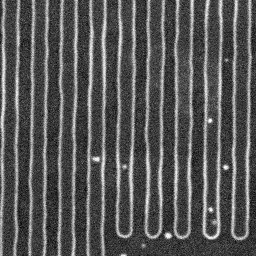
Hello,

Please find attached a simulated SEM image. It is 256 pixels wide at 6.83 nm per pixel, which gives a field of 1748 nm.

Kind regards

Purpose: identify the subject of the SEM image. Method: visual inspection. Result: groups of lines, slits or small figures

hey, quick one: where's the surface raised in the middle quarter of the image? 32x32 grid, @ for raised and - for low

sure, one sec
@@@----@@@----@@@@---@@@@---@@@@
@@@----@@@----@@@@---@@@@---@@@@
@@@----@@@----@@@@---@@@@---@@@@
@@@----@@@----@@@@---@@@@---@@@@
@@@----@@@----@@@@---@@@@---@@@@
@@@----@@@----@@@@---@@@@---@@@@
@@@---@@@@----@@@@---@@@@---@@@@
@@@---@@@@----@@@@---@@@@---@@@@
@@@---@@@@----@@@@---@@@@---@@@@
@@@---@@@@----@@@@---@@@@---@@@@
@@@---@@@@----@@@----@@@----@@@@
@@@---@@@@----@@@----@@@----@@@@
@@@---@@@@----@@@----@@@----@@@@
@@@---@@@@----@@@----@@@----@@@@
@@@---@@@@----@@@----@@@----@@@@
@@@---@@@@----@@@----@@@----@@@@
@@@---@@@@----@@@----@@@----@@@@
@@@---@@@@----@@@----@@@----@@@@
@@@---@@@@---@@@@----@@@----@@@@
@@@---@@@@---@@@@----@@@----@@@@
@@@---@@@@---@@@@----@@@----@@@@
@@@---@@@@---@@@@----@@@----@@@@
@@@---@@@@----@@@----@@@----@@@@
@@@---@@@@----@@@----@@@----@@@@
@@@---@@@@----@@@----@@@----@@@-
@@@---@@@@----@@@----@@@----@@@-
@@@---@@@@----@@@----@@@----@@@-
@@@---@@@@----@@@----@@@----@@@-
@@@---@@@@----@@@----@@@----@@@-
@@@---@@@@----@@@----@@@----@@@-
@@@---@@@@----@@@----@@@----@@@@
@@@---@@@@----@@@----@@@----@@@@